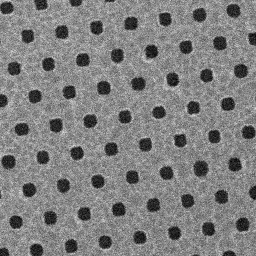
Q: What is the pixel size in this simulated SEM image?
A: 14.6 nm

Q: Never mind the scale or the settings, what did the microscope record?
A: a regular array of holes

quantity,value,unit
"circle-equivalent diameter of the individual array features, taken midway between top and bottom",0.221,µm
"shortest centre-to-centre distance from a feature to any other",0.504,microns